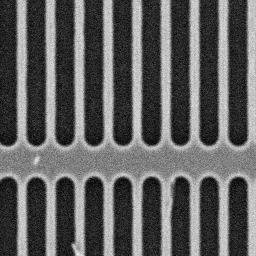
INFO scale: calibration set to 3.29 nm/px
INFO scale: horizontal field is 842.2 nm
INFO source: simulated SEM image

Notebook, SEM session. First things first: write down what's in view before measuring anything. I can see groups of lines, slits or small figures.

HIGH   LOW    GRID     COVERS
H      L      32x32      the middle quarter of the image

LLLHHLLLLLHHLLLLLHHLLLLLHHHLLLLL
LLLHHLLLLLHHLLLLLHHLLLLLHHHLLLLL
LLLHHLLLLLHHLLLLLHHLLLLLHHHLLLLL
LLLHHLLLLLHHLLLLLHHLLLLLHHHLLLLL
LLLHHLLLLLHHLLLLLHHLLLLLHHHLLLLL
LLLHHLLLLLHHLLLLLHHLLLLLHHHLLLLL
LLLHHLLLLLHHLLLLLHHLLLLLHHHLLLLL
LLLHHLLLLLHHLLLLLHHLLLLLHHHLLLLL
LLLHHLLLLLHHLLLLLHHLLLLLHHHLLLLL
LLLHHLLLLLHHLLLLLHHLLLLLHHHLLLLL
LLLHHLLLLLHHLLLLLHHLLLLLHHHLLLLL
LLLHHLLLLLHHLLLLLHHLLLLLLHLLLLLL
LLLHHLLLLLHHLLLLLHHLLLLLLHLLLLLL
LLLHHLLLLLHHLLLLLHHLLLLLLHLLLLLL
LLLHHLLLLLHHLLLLLHHLLLLLLHLLLLLL
LLLHHLLLLLHHLLLLLHHLLLLLHHHLLLLL
LLLHHLLLLLHHLLLLLHHLLLLLHHHLLLLL
LLLHHLLLLLHHLLLLLHHLLLLLHHHLLLLL
LLLHHLLLLLHHLLLLLHHLLLLLHHHLLLLL
LLHHHLLLLLHHHLLLLHHHLLLLHHHLLLLH
LHHHHHLLLHHHHHLHHHHHHLLHHHHHLLHH
HHHHHHHHHHHHHHHHHHHHHHHHHHHHHHHH
HHHHHHHHHHHHHHHHHHHHHHHHHHHHHHHH
HHHHHHHHHHHHHHHHHHHHHHHHHHHHHHHH
HHHHHHHHHHHHHHHHHHHHHHHHHHHHHHHH
HHHHHHHHHHHHHHHHHHHHHHHHHHHHHHHH
HHHHHHHHHHHHHHHHHHHHHHHHHHHHHHHH
HHHHHHHHHHHHHHHHHHHHHHHHHHHHHHHH
LHHHHHLLLHHHHHLLHHHHHLLHHHHHLLHH
LLHHHLLLLLHHHLLLLHHHLLLLHHHLLLLH
LLLHHLLLLLHHLLLLLHHLLLLLHHHLLLLL
LLLHHLLLLLHHLLLLLHHLLLLLHHHLLLLL